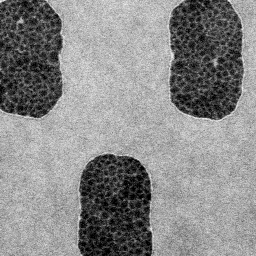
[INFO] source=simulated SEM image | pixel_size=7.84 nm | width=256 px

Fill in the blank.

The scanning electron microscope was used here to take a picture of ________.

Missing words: raised bodies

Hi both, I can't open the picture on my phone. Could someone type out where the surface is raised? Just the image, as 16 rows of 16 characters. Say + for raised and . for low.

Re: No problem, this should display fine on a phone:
+++........++++.
++++.......++++.
++++.......++++.
++++.......++++.
++++.......++++.
++++.......++++.
++++.......++++.
.............+..
................
................
.....++++.......
.....++++.......
.....++++.......
.....++++.......
.....++++.......
.....++++.......